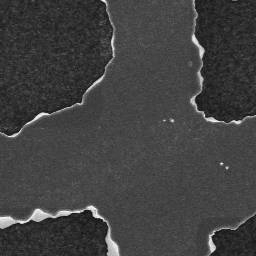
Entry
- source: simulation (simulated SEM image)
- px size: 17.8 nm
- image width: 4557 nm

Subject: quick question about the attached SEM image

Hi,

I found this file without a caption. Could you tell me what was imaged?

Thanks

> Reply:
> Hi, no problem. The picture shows holes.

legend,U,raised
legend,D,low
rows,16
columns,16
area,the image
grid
DDDDDDDUUUUUDDDD
DDDDDDDUUUUUDDDD
DDDDDDDUUUUUDDDD
DDDDDDDUUUUUUDDD
DDDDDDUUUUUUUDDD
DDDDDDUUUUUUUDDD
DDDDDUUUUUUUDDDD
DDUUUUUUUUUUUUDU
UUUUUUUUUUUUUUUU
UUUUUUUUUUUUUUUU
UUUUUUUUUUUUUUUU
UUUUUUUUUUUUUUUU
UUUUUUUUUUUUUUUU
UUDDDDUUUUUUUUUU
DDDDDDDUUUUUUUDD
DDDDDDDUUUUUUDDD